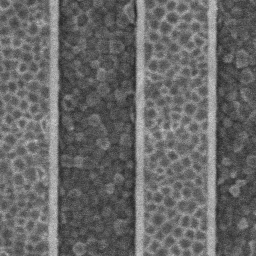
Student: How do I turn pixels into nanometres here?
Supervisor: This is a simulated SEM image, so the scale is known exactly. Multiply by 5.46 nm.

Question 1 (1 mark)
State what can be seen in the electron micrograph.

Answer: one or a few lines or trenches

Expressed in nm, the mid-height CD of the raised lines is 392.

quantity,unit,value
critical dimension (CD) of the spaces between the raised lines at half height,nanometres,471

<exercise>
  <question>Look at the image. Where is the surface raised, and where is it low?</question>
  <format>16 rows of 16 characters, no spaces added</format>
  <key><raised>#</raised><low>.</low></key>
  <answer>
###......####...
###......####...
###......####...
###......####...
###......####...
###......####...
###......####...
###......####...
###......####...
###......####...
###......####...
###......####...
###......####...
###......####...
###......####...
###......####...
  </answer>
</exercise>